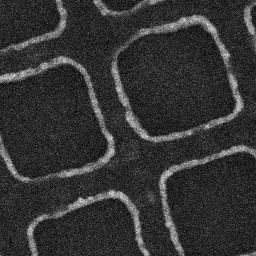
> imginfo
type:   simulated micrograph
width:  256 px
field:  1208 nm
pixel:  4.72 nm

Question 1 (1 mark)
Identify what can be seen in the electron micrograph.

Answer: holes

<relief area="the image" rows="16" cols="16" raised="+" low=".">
....+++.++++++++
....++++++++.+++
..++++++.....+++
+++++++.......++
+++..++.......++
.....+++.......+
......++.......+
......+++....+++
.......+++++++++
.......+++++++++
+....+++++++....
++++++++++......
++++++.+++......
++++....+++.....
++......+++.....
++.......++.....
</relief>